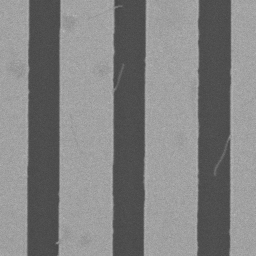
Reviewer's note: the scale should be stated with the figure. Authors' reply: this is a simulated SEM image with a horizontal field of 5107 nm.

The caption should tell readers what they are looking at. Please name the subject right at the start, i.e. lines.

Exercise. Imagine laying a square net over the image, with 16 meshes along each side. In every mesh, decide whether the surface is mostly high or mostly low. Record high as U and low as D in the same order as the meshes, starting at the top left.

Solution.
UUDDUUUDDUUUDDUU
UUDDUUUDDUUUDDUU
UUDDUUUDDUUUDDUU
UUDDUUUDDUUUDDUU
UUDDUUUDDUUUDDUU
UUDDUUUDDUUUDDUU
UUDDUUUDDUUUDDUU
UUDDUUUDDUUUDDUU
UUDDUUUDDUUUDDUU
UUDDUUUDDUUUDDUU
UUDDUUUDDUUUDDUU
UUDDUUUDDUUUDDUU
UUDDUUUDDUUUDDUU
UUDDUUUDDUUUDDUU
UUDDUUUDDUUUDDUU
UUDDUUUDDUUUDDUU